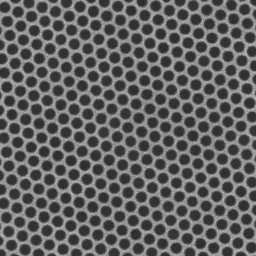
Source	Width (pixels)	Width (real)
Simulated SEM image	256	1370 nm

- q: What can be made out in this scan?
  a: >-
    a regular array of holes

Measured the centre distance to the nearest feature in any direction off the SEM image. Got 74.8 nm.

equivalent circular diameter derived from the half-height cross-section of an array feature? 62.2 nm